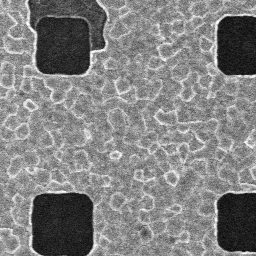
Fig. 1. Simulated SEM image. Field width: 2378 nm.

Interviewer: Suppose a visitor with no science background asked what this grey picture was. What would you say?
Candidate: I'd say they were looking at holes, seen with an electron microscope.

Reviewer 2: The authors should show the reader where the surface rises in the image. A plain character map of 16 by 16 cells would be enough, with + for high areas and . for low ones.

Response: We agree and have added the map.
++....++++++++++
++.....+++++++..
++.....+++++++..
++....++++++++..
+++..+++++++++..
++++++++++++++++
++++++++++++++++
++++++++++++++++
++++++++++++++++
++++++++++++++++
++++++++++++++++
++++++++++++++++
++....++++++++..
++....++++++++..
++....++++++++..
++....++++++++..